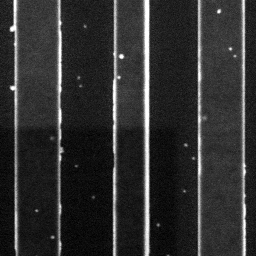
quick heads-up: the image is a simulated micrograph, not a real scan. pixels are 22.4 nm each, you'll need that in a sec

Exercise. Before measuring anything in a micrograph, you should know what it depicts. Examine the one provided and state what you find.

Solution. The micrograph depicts lines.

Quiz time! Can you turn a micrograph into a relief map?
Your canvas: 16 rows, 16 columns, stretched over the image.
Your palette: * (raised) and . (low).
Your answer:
.***...**...***.
.***...**...***.
.***...**...***.
.***...**...***.
.***...**...***.
.***...**...***.
.***...**...***.
.***...**...***.
.***...**...***.
.***...**...***.
.***...**...***.
.***...**...***.
.***...**...***.
.***...**...***.
.***...**...***.
.***...**...***.